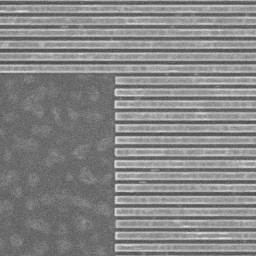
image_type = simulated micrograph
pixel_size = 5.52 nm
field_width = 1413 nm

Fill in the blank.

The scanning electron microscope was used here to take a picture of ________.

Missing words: parallel lines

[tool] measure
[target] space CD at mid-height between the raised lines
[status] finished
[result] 26.2 nanometres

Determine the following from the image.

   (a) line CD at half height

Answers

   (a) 40 nm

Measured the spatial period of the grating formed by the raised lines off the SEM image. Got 65.7 nanometres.